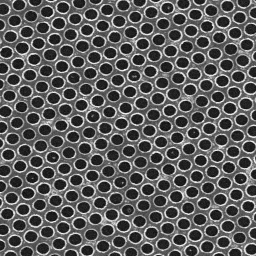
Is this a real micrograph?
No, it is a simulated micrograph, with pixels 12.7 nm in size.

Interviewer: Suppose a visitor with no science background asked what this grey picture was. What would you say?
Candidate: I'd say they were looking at a regular array of holes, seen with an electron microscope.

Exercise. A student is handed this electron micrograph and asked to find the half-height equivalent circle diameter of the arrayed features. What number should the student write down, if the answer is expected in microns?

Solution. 0.151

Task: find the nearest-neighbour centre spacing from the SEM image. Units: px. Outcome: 16.3